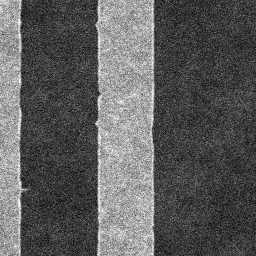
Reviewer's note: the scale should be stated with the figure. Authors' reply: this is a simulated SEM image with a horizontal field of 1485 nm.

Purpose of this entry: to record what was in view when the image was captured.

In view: one or a few lines or trenches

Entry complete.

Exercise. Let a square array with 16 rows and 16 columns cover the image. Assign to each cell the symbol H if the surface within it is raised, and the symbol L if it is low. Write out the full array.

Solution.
HLLLLLHHHHLLLLLL
HLLLLLHHHHLLLLLL
HLLLLLHHHHLLLLLL
HLLLLLHHHHLLLLLL
HLLLLLHHHHLLLLLL
HLLLLLHHHHLLLLLL
HLLLLLHHHHLLLLLL
HLLLLLHHHHLLLLLL
HLLLLLHHHLLLLLLL
HLLLLLHHHHLLLLLL
HLLLLLHHHHLLLLLL
HLLLLLHHHHLLLLLL
HLLLLLHHHHLLLLLL
HLLLLLHHHHLLLLLL
HLLLLLHHHHLLLLLL
HLLLLLHHHHLLLLLL